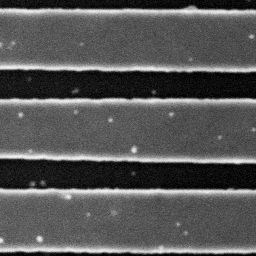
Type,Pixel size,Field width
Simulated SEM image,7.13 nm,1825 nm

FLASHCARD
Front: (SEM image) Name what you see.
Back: lines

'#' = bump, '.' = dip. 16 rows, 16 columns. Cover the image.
................
################
################
################
................
................
################
################
################
################
................
................
################
################
################
################